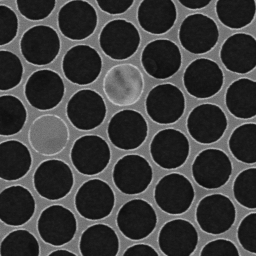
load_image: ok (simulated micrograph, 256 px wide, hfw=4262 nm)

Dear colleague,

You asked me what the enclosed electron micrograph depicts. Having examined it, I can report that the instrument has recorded a regular array of holes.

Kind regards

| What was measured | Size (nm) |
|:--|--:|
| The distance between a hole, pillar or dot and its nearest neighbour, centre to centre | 748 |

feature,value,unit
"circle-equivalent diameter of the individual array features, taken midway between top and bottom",661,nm